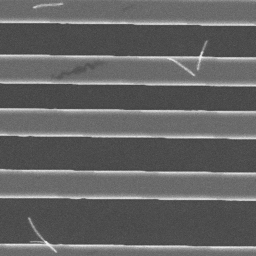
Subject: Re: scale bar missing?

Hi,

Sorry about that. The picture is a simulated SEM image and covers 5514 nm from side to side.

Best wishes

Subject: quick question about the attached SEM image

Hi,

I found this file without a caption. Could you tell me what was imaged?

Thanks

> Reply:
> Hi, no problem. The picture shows lines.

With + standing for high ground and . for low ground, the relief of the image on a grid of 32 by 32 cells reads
++++++++++++++++++++++++++++++++
++++++++++++++++++++++++++++++++
++++++++++++++++++++++++++++++++
................................
................................
................................
................................
++++++++++++++++++++++++++++++++
++++++++++++++++++++++++++++++++
++++++++++++++++++++++++++++++++
...........+++++++++++++++++++++
................................
................................
................................
++++++++++++++++++++++++++++++++
++++++++++++++++++++++++++++++++
++++++++++++++++++++++++++++++++
................................
................................
................................
................................
++++++++++++++++................
++++++++++++++++++++++++++++++++
++++++++++++++++++++++++++++++++
++++++++++++++++++++++++++++++++
................................
................................
................................
................................
................................
................................
++++++++++++++++++++++++++++++++